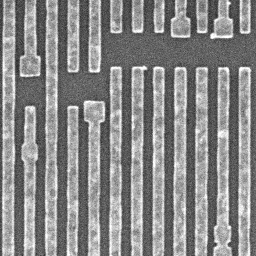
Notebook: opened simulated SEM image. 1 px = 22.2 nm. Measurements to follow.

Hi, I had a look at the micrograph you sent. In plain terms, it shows wiring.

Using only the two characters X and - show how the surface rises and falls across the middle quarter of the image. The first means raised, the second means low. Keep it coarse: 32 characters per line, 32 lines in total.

-XXX--XXX-----------------------
-XXX--XXX---XX---XXX---XX---XX--
------------XX---XXX--XXX---XX--
------------XX---XXX--XXX---XX--
------------XX---XXX--XXX---XX--
------------XX---XXX--XXX---XX--
------------XX---XXX---XX---XX--
------------XX---XXX---XX---XX--
------------XX---XXX---XX---XX--
-----XXX----XX---XXX---XX---XX--
-----XXXXX--XX---XXX---XX---XX--
-XX--XXXXX--XX---XXX---XX---XX--
-XX--XXXXX--XX---XXX---XX---XX--
-XX--XXXXX--XX---XXX--XXX---XX--
-XX---XXX---XX---XXX--XXX---XX--
-XX---XXX---XX---XXX--XXX---XX--
-XX---XXX---XX---XXX--XXX---XX--
-XX---XXX---XX---XXX--XXX---XX--
-XX---XXX---XX---XXX--XXX---XX--
-XX---XXX---XX---XXX--XXX---XX--
-XX---XXX---XX---XXX--XXX---XX--
-XX---XXX---XX---XX----XX---XX--
-XX---XXX---XX---XX---XXX---XX--
-XX---XXX---XX---XX---XXX---XX--
-XX---XXX---XX---XX---XXX---XX--
-XX---XXX---XX---XX---XXX---XX--
-XX---XXX---XX---XX---XXX---XX--
-XX---XXX---XX---XX---XXX---XX--
-XX---XXX---XX---XX---XXX---XX--
-XX---XXX---XX---XX---XXX---XX--
-XX---XXX---XX---XX---XXX---XX--
-XX---XXX---XX---XX---XXX---XX--